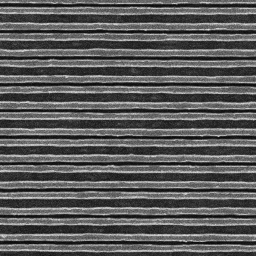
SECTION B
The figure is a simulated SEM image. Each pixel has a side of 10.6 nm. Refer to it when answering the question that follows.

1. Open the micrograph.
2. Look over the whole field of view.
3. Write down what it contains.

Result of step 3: parallel lines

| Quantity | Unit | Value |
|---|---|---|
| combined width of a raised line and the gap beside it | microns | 0.14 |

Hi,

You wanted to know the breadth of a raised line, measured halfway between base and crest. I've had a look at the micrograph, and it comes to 71.8 nm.